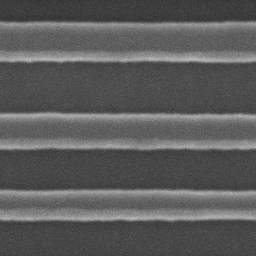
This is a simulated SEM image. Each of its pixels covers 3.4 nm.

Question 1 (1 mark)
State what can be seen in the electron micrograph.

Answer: lines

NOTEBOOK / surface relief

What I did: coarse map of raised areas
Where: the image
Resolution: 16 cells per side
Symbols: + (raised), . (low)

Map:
................
++++++++++++++++
++++++++++++++++
++++++++++++++++
................
................
................
++++++++++++++++
++++++++++++++++
................
................
................
++++++++++++++++
++++++++++++++++
................
................